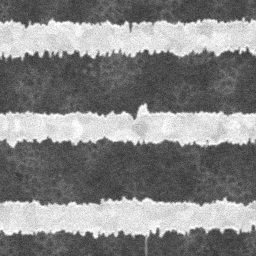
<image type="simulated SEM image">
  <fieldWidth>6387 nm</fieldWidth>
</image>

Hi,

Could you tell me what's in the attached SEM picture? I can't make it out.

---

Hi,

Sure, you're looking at one or a few lines or trenches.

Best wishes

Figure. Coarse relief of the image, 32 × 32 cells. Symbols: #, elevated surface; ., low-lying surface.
................................
................................
................................
################################
################################
################################
#########.####.##.....##...#....
.................#..............
................#...............
................................
................................
................................
................................
................................
################.###########.###
################################
################################
.###...#.###..#.####.##########.
................................
................................
................................
................................
................................
................................
................................
#####.#.....############...##..#
################################
################################
########################.###.##.
................................
................................
................................